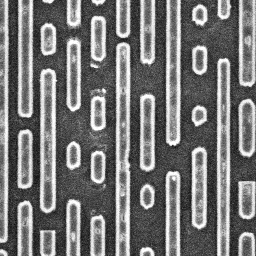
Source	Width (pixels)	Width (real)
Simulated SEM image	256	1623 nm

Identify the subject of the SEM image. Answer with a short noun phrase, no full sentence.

parallel lines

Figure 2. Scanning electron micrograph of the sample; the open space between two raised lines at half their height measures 88 nm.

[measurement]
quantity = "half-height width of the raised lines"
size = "68.9 nm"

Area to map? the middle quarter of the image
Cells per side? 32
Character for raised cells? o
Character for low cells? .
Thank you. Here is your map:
.ooo.........ooo..........ooo...
.ooo.........ooo..........ooo...
.ooo.........ooo..........ooo...
.ooo.........ooo..........ooo...
.ooo.........ooo..........ooo...
.ooo.........ooo..........ooo...
.ooo.........ooo..........ooo...
.ooo.........ooo..........ooo...
.ooo....o....ooo....oo....ooo...
.ooo...ooo...ooo....oo....ooo...
.ooo...ooo...ooo....oo....ooo...
.......ooo...ooo....oo....ooo...
.......ooo...ooo....oo....ooo...
.......ooo...ooo....oo....ooo...
.......ooo...ooo....oo....ooo...
.......ooo...ooo....oo....ooo...
.............ooo....oo....ooo...
.............ooo....oo....ooo...
.............ooo....oo....ooo...
.............ooo....oo....oo....
..o..........ooo...ooo..........
.ooo.........ooo....oo..........
.ooo....o....ooo....oo..........
.ooo...ooo...ooo....oo..........
.ooo...ooo...ooo...ooo..........
..o....ooo...ooo....oo..........
.......ooo...ooo................
.......ooo...ooo..........oo....
.......ooo...ooo..........oo....
.............ooo..........oo....
.............ooo....o.....oo....
.............ooo....oo....oo....